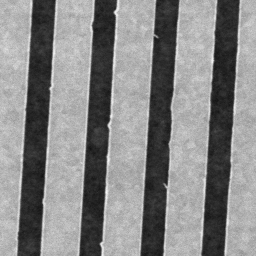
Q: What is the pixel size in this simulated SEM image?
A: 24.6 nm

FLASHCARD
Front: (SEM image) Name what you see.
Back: one or a few lines or trenches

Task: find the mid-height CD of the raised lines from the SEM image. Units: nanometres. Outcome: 919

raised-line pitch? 1510 nanometers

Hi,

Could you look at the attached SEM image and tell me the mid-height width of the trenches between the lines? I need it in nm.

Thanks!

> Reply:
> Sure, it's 606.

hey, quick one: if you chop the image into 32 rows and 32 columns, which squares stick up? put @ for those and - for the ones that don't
@@@@---@@@@@---@@@@---@@@@@---@@
@@@@---@@@@@--@@@@@---@@@@@---@@
@@@@---@@@@@---@@@@---@@@@@---@@
@@@@---@@@@----@@@@---@@@@@---@@
@@@@---@@@@---@@@@@---@@@@@---@@
@@@@---@@@@---@@@@@---@@@@@---@@
@@@@---@@@@---@@@@@---@@@@@---@@
@@@@---@@@@---@@@@@---@@@@@---@@
@@@----@@@@---@@@@@---@@@@----@@
@@@----@@@@---@@@@@---@@@@----@@
@@@---@@@@@---@@@@@---@@@@----@@
@@@---@@@@@---@@@@@---@@@@---@@@
@@@---@@@@@---@@@@@---@@@@---@@@
@@@---@@@@@---@@@@@--@@@@@---@@@
@@@---@@@@@---@@@@----@@@@---@@@
@@@---@@@@@---@@@@----@@@@---@@@
@@@---@@@@@---@@@@---@@@@@---@@@
@@@---@@@@@---@@@@---@@@@@---@@@
@@@---@@@@@---@@@@---@@@@@---@@@
@@@---@@@@@--@@@@@---@@@@@---@@@
@@@---@@@@----@@@@---@@@@@---@@@
@@@---@@@@---@@@@@---@@@@@---@@@
@@@---@@@@---@@@@@---@@@@@---@@@
@@@---@@@@---@@@@@---@@@@@---@@@
@@----@@@@---@@@@@---@@@@@---@@@
@@---@@@@@---@@@@@---@@@@---@@@@
@@---@@@@@---@@@@@---@@@@---@@@@
@@---@@@@@---@@@@@---@@@@---@@@@
@@---@@@@@---@@@@@---@@@@---@@@@
@@---@@@@@---@@@@@---@@@@---@@@@
@@---@@@@@---@@@@----@@@@---@@@@
@@---@@@@@---@@@@----@@@@---@@@@